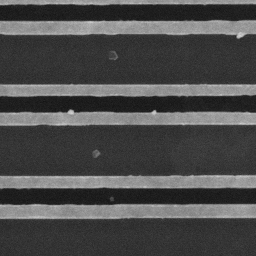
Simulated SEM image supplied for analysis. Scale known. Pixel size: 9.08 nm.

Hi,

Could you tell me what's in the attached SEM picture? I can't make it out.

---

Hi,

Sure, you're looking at lines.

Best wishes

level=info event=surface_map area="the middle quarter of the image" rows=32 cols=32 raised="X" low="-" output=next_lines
--------------------------------
--------------------------------
--------------------------------
--------------------------------
--------------------------------
XXXXXXXXXXXXXXXXXXXXXXXXXXXXXXXX
XXXXXXXXXXXXXXXXXXXXXXXXXXXXXXXX
XXXXXXXXXXXXXXXXXXXXXXXXXXXXXXXX
--------------------------------
--------------------------------
--------------------------------
--------------------------------
XXXXXXXXXXXXXXXXXXXXXXXXXXXXXXXX
XXXXXXXXXXXXXXXXXXXXXXXXXXXXXXXX
XXXXXXXXXXXXXXXXXXXXXXXXXXXXXXXX
--------------------------------
--------------------------------
--------------------------------
--------------------------------
--------------------------------
--------------------------------
--------------------------------
--------------------------------
--------------------------------
--------------------------------
--------------------------------
--------------------------------
--------------------------------
XXXXXXXXXXXXXXXXXXXXXXXXXXXXXXXX
XXXXXXXXXXXXXXXXXXXXXXXXXXXXXXXX
XXXXXXXXXXXXXXXXXXXXXXXXXXXXXXXX
--------------------------------